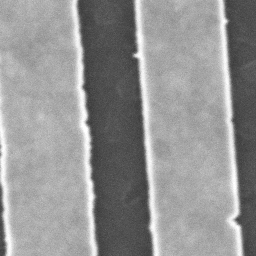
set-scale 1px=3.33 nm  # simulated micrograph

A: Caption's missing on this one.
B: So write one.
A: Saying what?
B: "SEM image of one or a few lines or trenches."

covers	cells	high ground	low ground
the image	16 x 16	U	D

UUUUUDDDDUUUUUDD
UUUUUDDDDUUUUUDD
UUUUUDDDDUUUUUDD
UUUUUDDDDUUUUUDD
UUUUUDDDDUUUUUDD
UUUUUDDDDUUUUUDD
UUUUUDDDDUUUUUDD
UUUUUDDDDUUUUUDD
UUUUUDDDDUUUUUDD
UUUUUUDDDUUUUUUD
UUUUUUDDDUUUUUUD
UUUUUUDDDUUUUUUD
UUUUUUDDDUUUUUUD
UUUUUUDDDDUUUUUD
UUUUUUDDDDUUUUUD
DUUUUUDDDDUUUUUD